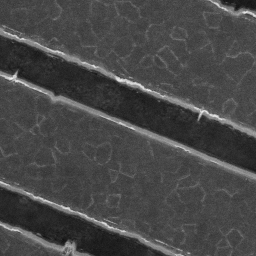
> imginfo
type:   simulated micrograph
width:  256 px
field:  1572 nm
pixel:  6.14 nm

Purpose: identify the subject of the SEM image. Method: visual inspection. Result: one or a few lines or trenches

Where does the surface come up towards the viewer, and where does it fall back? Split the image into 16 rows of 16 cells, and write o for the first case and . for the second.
oooooooooooooo..
oooooooooooooooo
.ooooooooooooooo
....oooooooooooo
.......ooooooooo
oo.......ooooooo
ooooo......ooooo
ooooooo.......oo
oooooooooo......
oooooooooooo....
ooooooooooooooo.
oooooooooooooooo
...ooooooooooooo
.....ooooooooooo
o.......oooooooo
ooooo.....oooooo